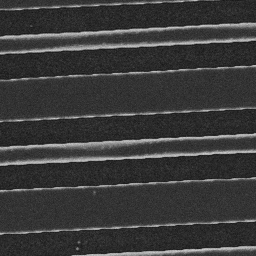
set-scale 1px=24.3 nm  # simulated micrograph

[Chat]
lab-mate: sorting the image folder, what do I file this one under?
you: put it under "lines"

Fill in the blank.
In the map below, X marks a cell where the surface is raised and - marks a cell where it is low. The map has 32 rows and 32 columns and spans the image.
XXXXXXXXXXXXXXX-----------------
--------------------------------
--------------------------------
---------------------XXXXXXXXXXX
----XXXXXXXXXXXXXXXXXXXXXXXXXXXX
XXXXXXXXXXXXXXXXXXXXX-----------
XX------------------------------
--------------------------------
---------------------------XXXXX
--------XXXXXXXXXXXXXXXXXXXXXXXX
XXXXXXXXXXXXXXXXXXXXXXXXXXXXXXXX
XXXXXXXXXXXXXXXXXXXXXXXXXXXXXXXX
XXXXXXXXXXXXXXXXXXXXXXXXXXXXXXXX
XXXXXXXXXXXXXXXXXXXXXXXXXXXXXXX-
XXXXXXXXXXXX--------------------
--------------------------------
--------------------------------
-------------------XXXXXXXXXXXXX
XXXXXXXXXXXXXXXXXXXXXXXXXXXXXXXX
XXXXXXXXXXXXXXXXXXXXX-----------
XXX-----------------------------
--------------------------------
-------------------------XXXXXXX
------XXXXXXXXXXXXXXXXXXXXXXXXXX
XXXXXXXXXXXXXXXXXXXXXXXXXXXXXXXX
XXXXXXXXXXXXXXXXXXXXXXXXXXXXXXXX
XXXXXXXXXXXXXXXXXXXXXXXXXXXXXXXX
XXXXXXXXXXXXXXXXXXXXXXXXXXXXXXXX
XXXXXXXXXXXXXXX-----------------
--------------------------------
--------------------------------
-------------------XXXXXXXXXXXXX